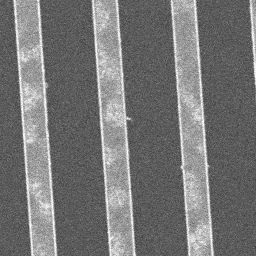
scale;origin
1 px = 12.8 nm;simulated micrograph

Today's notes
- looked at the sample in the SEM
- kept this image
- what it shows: one or a few lines or trenches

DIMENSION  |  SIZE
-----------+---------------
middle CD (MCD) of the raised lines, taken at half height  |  0.303 um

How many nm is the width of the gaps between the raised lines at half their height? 706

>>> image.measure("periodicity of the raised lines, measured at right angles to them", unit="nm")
1000